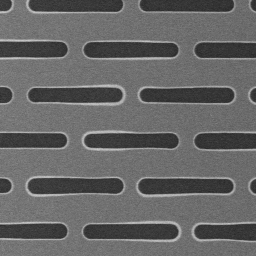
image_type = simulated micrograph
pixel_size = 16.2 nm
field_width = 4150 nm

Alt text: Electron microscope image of groups of lines, slits or small figures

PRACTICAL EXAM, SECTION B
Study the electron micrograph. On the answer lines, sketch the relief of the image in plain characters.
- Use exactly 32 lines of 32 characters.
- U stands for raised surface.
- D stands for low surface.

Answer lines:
DUUUDDDDDDDDDDDUUUDDDDDDDDDDDUUD
UUUUUDDDDDDDDDUUUUUUUUDDDDDDUUUU
UUUUUUUUUUUUUUUUUUUUUUUUUUUUUUUU
UUUUUUUUUUUUUUUUUUUUUUUUUUUUUUUU
UUUUUUUUUUUUUUUUUUUUUUUUUUUUUUUU
DDDDDDDDUUUDDDDDDDDDDDUUUDDDDDDD
DDDDDDDDUUDDDDDDDDDDDDUUDDDDDDDD
UUUUUUUUUUUUUUUUUUUUUUUUUUUUUUUU
UUUUUUUUUUUUUUUUUUUUUUUUUUUUUUUU
UUUUUUUUUUUUUUUUUUUUUUUUUUUUUUUU
UUUUUUUUUUUUUUUUUUUUUUUUUUUUUUUU
DUUUDDDDDDDDDDDUUUDDDDDDDDDDDUUD
DUUUDDDDDDDDDDDUUUDDDDDDDDDDDUUU
UUUUUUUUUUUUUUUUUUUUUUUUUUUUUUUU
UUUUUUUUUUUUUUUUUUUUUUUUUUUUUUUU
UUUUUUUUUUUUUUUUUUUUUUUUUUUUUUUU
UUUUUUUUUUUUUDDUUUUUUUUUUUUUUUUU
DDDDDDDDUUDDDDDDDDDDDDUUDDDDDDDD
DDDDDDDDUUUDDDDDDDDDDDUUUDDDDDDD
UUUUUUUUUUUUUUUUUUUUUUUUUUUUUUUU
UUUUUUUUUUUUUUUUUUUUUUUUUUUUUUUU
UUUUUUUUUUUUUUUUUUUUUUUUUUUUUUUU
DUUUDDDDDDDDDDDUUUDDDDDDDDDDDUUU
DUUDDDDDDDDDDDDUUDDDDDDDDDDDDUUD
UUUUUUUUUUUUUUUUUUDDUUUUUUUUUUUU
UUUUUUUUUUUUUUUUUUUUUUUUUUUUUUUU
UUUUUUUUUUUUUUUUUUUUUUUUUUUUUUUU
UUUUUUUUUUUUUUUUUUUUUUUUUUUUUUUU
DDDDDDDDUUUDDDDDDDDDDDUUDDDDDDDD
DDDDDDDDUUUDDDDDDDDDDDUUDDDDDDDD
UUUUUUUUUUUUUUUUUUUUUUUUUUUUUUUU
UUUUUUUUUUUUUUUUUUUUUUUUUUUUUUUU